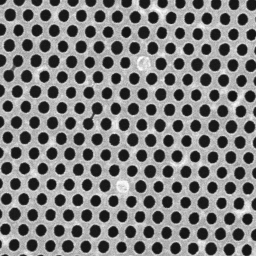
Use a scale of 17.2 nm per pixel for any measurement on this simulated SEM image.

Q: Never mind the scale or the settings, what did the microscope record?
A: a regular array of holes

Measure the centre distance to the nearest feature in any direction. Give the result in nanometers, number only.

300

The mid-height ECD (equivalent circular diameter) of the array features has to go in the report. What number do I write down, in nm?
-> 209